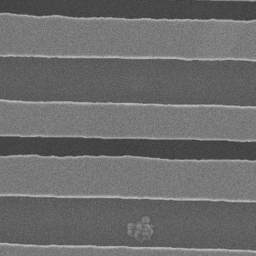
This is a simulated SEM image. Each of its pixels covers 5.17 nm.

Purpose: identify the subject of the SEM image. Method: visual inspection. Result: lines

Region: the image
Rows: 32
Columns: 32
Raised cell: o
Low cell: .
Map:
................................
................................
ooooooooooooooooooooooooo.o.....
oooooooooooooooooooooooooooooooo
oooooooooooooooooooooooooooooooo
oooooooooooooooooooooooooooooooo
oooooooooooooooooooooooooooooooo
.......................o......oo
................................
................................
................................
................................
................................
oooooooooooooooooooooooooooooooo
oooooooooooooooooooooooooooooooo
oooooooooooooooooooooooooooooooo
oooooooooooooooooooooooooooooooo
............................oooo
................................
..ooo...........................
oooooooooooooooooooooooooooooooo
oooooooooooooooooooooooooooooooo
oooooooooooooooooooooooooooooooo
oooooooooooooooooooooooooooooooo
....oooooooooooooooooooooooooooo
................................
................................
................................
................................
................................
o...............................
oooooooooooooooooooooooooooooooo